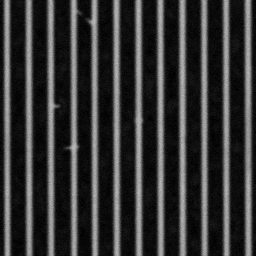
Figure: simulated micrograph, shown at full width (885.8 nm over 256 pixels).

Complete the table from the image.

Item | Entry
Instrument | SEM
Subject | parallel lines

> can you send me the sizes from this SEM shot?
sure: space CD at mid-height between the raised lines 55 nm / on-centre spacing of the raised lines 75.9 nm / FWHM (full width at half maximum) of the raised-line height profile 20.4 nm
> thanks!